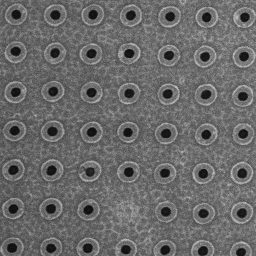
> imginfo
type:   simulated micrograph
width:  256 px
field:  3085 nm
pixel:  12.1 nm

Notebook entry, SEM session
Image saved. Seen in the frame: a regular array of ring-shaped raised bodies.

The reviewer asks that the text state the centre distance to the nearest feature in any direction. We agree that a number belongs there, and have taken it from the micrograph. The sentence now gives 452 nanometers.